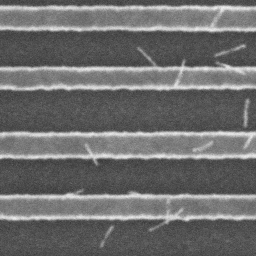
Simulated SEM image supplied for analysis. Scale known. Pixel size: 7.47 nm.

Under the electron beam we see lines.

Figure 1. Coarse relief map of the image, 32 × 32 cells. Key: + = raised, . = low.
................................
++++++++++++++++++++++++++++++++
++++++++++++++++++++++++++++++++
++++++++++++++++++++++++++++++++
................................
................................
................................
................................
+++++++++.+++++++++++++++++.++++
++++++++++++++++++++++++++++++++
++++++++++++++++++++++++++++++++
................................
................................
................................
................................
................................
................................
++++++++++++++++++++++++++++++++
++++++++++++++++++++++++++++++++
++++++++++++++++++++++++++++++++
................................
................................
................................
................................
++++++++++++++++++++++++++++++++
++++++++++++++++++++++++++++++++
++++++++++++++++++++++++++++++++
................................
................................
................................
................................
................................